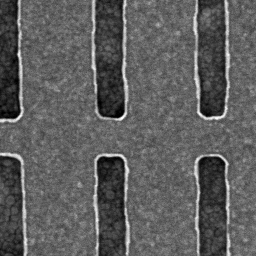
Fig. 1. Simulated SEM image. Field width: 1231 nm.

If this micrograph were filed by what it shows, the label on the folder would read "holes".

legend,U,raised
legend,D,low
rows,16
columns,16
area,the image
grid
DUUUUUDDUUUUDDUU
DUUUUUDDUUUUDDUU
DUUUUUDDUUUUDDUU
DUUUUUDDUUUUDDUU
DUUUUUDDUUUUDDUU
DUUUUUDDUUUUDDUU
DUUUUUDDUUUUDDUU
UUUUUUUUUUUUUUUU
UUUUUUUUUUUUUUUU
UUUUUUUUUUUUUUUU
DUUUUUDDUUUUDDUU
DUUUUUDDUUUUDDUU
DUUUUUDDUUUUDDUU
DUUUUUDDUUUUDDUU
DDUUUUDDUUUUDDUU
DDUUUUDDUUUUDDUU